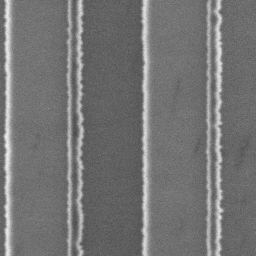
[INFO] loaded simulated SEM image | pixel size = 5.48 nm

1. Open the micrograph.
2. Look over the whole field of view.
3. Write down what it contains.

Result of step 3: lines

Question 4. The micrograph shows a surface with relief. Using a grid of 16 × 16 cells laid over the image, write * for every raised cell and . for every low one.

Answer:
*****....*****..
*****....*****..
*****....*****..
*****....*****..
*****....*****..
*****....*****..
*****....*****..
*****....*****..
*****....*****..
*****....*****..
*****....*****..
*****....*****..
*****....*****..
*****....*****..
*****....*****..
*****....*****..